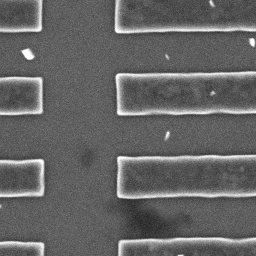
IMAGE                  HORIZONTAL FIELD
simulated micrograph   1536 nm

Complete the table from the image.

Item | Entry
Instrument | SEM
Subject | wiring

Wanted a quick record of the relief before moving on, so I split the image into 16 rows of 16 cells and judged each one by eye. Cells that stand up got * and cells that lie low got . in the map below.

***....*********
**.....*********
................
................
................
***....*********
***....*********
................
................
................
***....*********
***....*********
................
................
................
***....*********